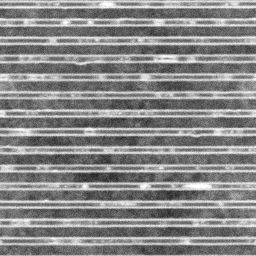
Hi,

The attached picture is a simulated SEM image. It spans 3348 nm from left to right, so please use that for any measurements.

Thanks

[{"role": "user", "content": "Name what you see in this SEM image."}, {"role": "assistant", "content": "parallel lines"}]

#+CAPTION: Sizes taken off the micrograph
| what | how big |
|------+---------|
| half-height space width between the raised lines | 154 nanometres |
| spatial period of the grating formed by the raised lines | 0.238 micrometres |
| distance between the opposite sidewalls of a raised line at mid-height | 0.0834 micrometres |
